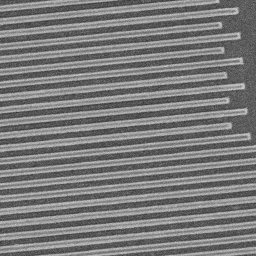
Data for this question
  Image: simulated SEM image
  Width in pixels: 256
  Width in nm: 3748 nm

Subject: parallel lines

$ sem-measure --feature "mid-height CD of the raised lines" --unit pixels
3.98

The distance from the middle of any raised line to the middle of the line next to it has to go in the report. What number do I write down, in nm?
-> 185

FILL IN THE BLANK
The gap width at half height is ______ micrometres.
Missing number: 0.129